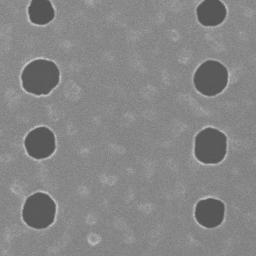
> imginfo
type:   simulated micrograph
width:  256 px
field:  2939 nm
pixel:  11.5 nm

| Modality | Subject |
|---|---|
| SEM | holes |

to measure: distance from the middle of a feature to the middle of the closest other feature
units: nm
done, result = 768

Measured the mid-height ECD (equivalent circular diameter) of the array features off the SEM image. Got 404 nanometers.